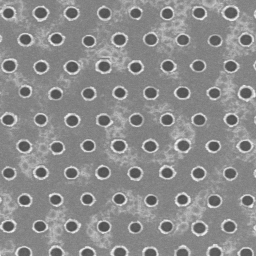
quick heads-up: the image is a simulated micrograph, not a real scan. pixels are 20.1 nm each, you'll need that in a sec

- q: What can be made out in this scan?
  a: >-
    a regular array of holes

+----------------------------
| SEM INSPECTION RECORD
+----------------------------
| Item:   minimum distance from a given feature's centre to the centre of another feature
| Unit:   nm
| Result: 607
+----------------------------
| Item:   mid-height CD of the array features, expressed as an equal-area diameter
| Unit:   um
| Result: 0.229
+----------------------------